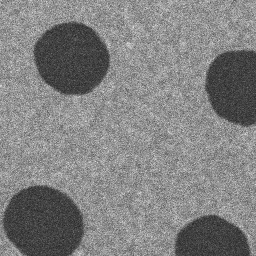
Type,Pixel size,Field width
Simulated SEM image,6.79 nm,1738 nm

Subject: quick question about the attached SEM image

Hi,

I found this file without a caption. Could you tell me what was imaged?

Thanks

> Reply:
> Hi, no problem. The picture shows holes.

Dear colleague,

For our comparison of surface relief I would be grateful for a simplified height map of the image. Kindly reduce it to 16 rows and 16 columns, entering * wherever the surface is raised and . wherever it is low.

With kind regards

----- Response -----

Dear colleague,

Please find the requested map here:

****************
****.***********
**....**********
**.....*******..
**.....******...
***...*******...
*************...
**************..
****************
****************
****************
****************
*....***********
.....********.**
.....******....*
*....******.....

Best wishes